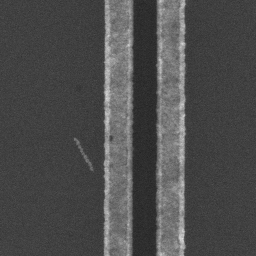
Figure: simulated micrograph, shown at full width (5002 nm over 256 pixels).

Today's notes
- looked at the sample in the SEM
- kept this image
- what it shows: lines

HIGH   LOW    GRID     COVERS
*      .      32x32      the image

.............***....***.........
.............***....***.........
.............***....***.........
.............***....***.........
.............***....***.........
.............***....***.........
.............***....***.........
.............***....***.........
.............***....***.........
.............***....***.........
.............***....***.........
.............***....***.........
.............***....***.........
.............***....***.........
.............***....***.........
.............***....***.........
.............***....***.........
.............***....***.........
.............***....***.........
.............***....***.........
.............***....***.........
.............***....***.........
.............***....***.........
.............***....***.........
.............***....***.........
.............***....***.........
.............***....***.........
.............***....***.........
.............***....***.........
.............***....***.........
.............***....***.........
.............***....***.........